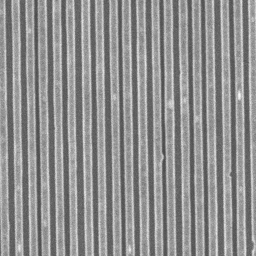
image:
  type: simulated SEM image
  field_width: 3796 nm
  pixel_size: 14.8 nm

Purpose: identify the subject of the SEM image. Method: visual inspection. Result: parallel lines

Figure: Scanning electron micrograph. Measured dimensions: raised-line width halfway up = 115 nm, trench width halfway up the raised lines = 102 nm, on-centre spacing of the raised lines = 206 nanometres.